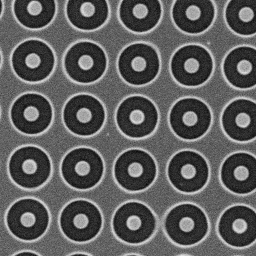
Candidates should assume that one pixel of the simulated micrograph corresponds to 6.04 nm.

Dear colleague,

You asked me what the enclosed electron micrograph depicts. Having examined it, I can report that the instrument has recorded an array of small figures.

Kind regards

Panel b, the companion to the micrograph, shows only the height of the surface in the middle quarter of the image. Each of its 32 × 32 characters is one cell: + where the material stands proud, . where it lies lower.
....+++....++....+++....++....++
..........++++....++....+++....+
+.........++++.........++++.....
+........++++++........++++.....
+++....+++++++++.....+++++++....
++++++++++++++++++.+++++++++++..
++++++++++++++++++++++++++++++++
++++++++++++++++++++++++++++++++
++......++++++++.....++++++++++.
+........++++++.......++++++....
..........++++.........++++.....
....++....+++..........++++.....
...++++...+++....+++...+++....++
...++++...+++....+++....++....++
....++....+++.....+....+++....++
.........++++..........++++.....
+........+++++.........++++.....
+++.....+++++++.......++++++....
+++++++++++++++++..++++++++++...
++++++++++++++++++++++++++++++++
++++++++++++++++++++++++++++++++
++......+++++++++..+++++++++++..
+........+++++.......+++++++....
.........++++.........+++++.....
..........+++..........+++......
...+++....+++...+++....+++....++
...+++....+++...+++....+++....++
....+.....++....+++....+++....++
.........++++..........+++......
.........++++.........+++++.....
+.......++++++.......++++++.....
+++++++++++++++....+++++++++....